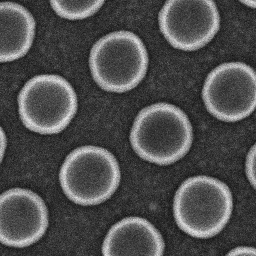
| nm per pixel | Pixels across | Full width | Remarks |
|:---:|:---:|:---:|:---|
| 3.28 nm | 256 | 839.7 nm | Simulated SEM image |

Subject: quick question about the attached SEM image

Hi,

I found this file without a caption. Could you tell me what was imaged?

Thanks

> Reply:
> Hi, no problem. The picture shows raised bodies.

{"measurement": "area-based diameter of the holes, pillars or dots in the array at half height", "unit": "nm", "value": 181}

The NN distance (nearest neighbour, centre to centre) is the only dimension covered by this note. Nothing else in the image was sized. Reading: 0.272 microns